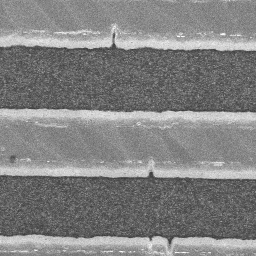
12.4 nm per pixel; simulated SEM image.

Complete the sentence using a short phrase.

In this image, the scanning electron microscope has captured one or a few lines or trenches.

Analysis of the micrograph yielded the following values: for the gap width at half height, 865 nanometers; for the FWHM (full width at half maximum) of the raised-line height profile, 723 nanometres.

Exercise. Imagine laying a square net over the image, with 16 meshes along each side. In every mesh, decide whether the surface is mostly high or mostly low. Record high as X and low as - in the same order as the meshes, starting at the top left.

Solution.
XXXXXXXXXXXXXXXX
XXXXXXXXXXXXXXXX
XXXXXXXXXXXXXXXX
----------------
----------------
----------------
----------------
XXXXXXXXXXXXXXXX
XXXXXXXXXXXXXXXX
XXXXXXXXXXXXXXXX
XXXXXXXXXXXXXXXX
----------------
----------------
----------------
----------------
XXXXXXXXXXXXXXXX